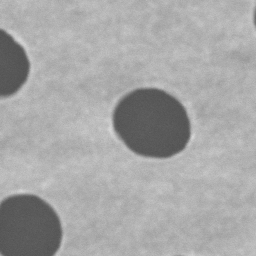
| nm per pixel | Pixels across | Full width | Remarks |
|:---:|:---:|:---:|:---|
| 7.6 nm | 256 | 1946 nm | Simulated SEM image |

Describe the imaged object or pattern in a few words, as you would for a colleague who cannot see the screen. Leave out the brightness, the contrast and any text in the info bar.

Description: holes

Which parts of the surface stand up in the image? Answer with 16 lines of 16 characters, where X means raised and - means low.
XXXXXXXXXXXXXXXX
XXXXXXXXXXXXXXXX
-XXXXXXXXXXXXXXX
--XXXXXXXXXXXXXX
--XXXXXXXXXXXXXX
-XXXXXXXXXXXXXXX
XXXXXXX----XXXXX
XXXXXXX-----XXXX
XXXXXXX-----XXXX
XXXXXXXX---XXXXX
XXXXXXXXXXXXXXXX
XXXXXXXXXXXXXXXX
---XXXXXXXXXXXXX
----XXXXXXXXXXXX
----XXXXXXXXXXXX
----XXXXXXXXXXXX